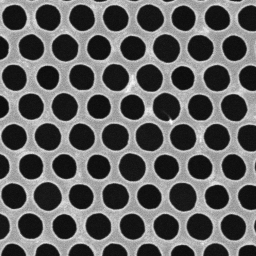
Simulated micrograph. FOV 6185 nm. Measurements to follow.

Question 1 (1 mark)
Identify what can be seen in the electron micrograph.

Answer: a regular array of holes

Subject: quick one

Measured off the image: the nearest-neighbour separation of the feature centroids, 808 nm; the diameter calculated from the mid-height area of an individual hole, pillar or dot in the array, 0.624 µm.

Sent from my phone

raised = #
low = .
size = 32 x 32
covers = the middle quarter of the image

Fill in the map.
###...#####....#####...#########
##.....###......###.....###.....
#......###......##.......##.....
#.......#.......##.......##.....
##......##......##.......##.....
##.....###......###.....####....
####..######..######...######..#
.#######################...#####
...####....####....####.....####
...###.....###......##.......##.
...###......##......##.......##.
...###......##......##.......##.
...###.....####.....###......##.
..######..######...#####....####
################################
###...#####....####....#####...#
##.....###......##......###.....
#.......#.......##.......#......
#.......#.......##.......#......
##......##......##.......##.....
##.....###......###.....###.....
###...######..######...######..#
.###############.###############
..####.....###.....####.....####
...###.....###......###.....###.
...###......##......##.......##.
...###......##......###......##.
...###.....###......###.....###.
..#####...#####....#####...#####
################################
##....#####....####....####.....
#......###......###.....###.....